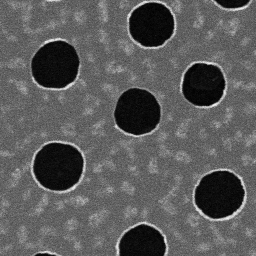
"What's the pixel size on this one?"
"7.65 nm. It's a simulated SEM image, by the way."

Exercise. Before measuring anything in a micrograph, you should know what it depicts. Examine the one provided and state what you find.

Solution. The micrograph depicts holes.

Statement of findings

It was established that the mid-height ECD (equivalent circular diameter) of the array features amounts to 363 nm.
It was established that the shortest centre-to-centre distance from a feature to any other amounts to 0.664 micrometres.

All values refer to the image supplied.